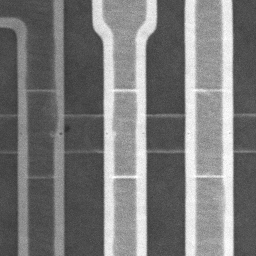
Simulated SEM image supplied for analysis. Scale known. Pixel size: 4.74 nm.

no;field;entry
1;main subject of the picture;wiring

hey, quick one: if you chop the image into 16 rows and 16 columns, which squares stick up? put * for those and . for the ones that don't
****..***...**..
.***..***...**..
.***...**...**..
.***...**...**..
.***...**...**..
.***...**...**..
.***...**...**..
.***...**...**..
.***...**...**..
.***...**...**..
.***...**...**..
.***...**...**..
.***...**...**..
.***...**...**..
.***...**...**..
.***...**...**..